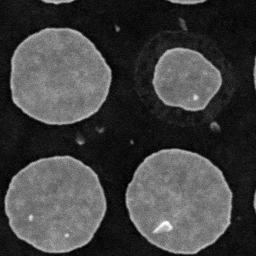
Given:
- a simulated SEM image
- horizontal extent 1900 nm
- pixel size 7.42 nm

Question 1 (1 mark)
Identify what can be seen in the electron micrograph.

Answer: raised bodies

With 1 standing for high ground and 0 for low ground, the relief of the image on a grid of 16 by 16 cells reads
0000000000000000
0000000000000000
0011100000000000
0111110000111000
0111111000111100
0111111000111100
0111110000011000
0011100000000000
0000000000000000
0000000000110000
0011110001111100
0111110011111100
1111111011111100
1111110011111100
0111110001111100
0011100000111000